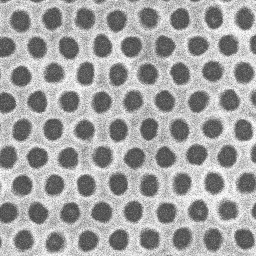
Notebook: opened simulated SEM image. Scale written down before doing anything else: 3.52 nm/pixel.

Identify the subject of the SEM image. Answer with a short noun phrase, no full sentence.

a regular array of holes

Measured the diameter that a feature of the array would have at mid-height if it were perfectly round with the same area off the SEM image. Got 0.0744 microns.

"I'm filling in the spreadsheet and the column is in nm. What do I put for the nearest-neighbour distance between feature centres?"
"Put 108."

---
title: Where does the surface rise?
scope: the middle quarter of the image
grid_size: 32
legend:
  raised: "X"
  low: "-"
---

XXXX----XXXX---XXXX---XXXXX----X
XXX-----XXX-----XX-----XXXX----X
XXX-----XXX-----XX------XX------
XXX----XXXX-----XX------XXX-----
XXXX---XXXXX---XXXX----XXXXX---X
XXXXX-XXXXXXX-XXXXXXXXXXXXXXXXXX
XXXXXXXXXXXXXXXXXXXXXXXXX-XXXXXX
---XXXXX---XXXXX---XXXX----XXXXX
----XXX-----XXX-----XXX-----XXX-
----XXX-----XXX-----XXX-----XXX-
----XXX-----XXX----XXXX-----XXX-
---XXXXX---XXXX---XXXXXX---XXXXX
XXXXXXXXXXXXXXXXXXXXXXXXXXXXXXXX
XXXXXXXXXXXXXXXXXXXXX-XXXXXXXXXX
XXXX---XXXXX---XXXXX---XXXX---XX
XXX----XXXX-----XXX-----XX-----X
XX------XXX-----XXX----XXX-----X
XXX-----XXX-----XXX----XXXX----X
XXXX---XXXXX---XXXXX---XXXX----X
XXXXXXXXXXXXXXXXXXXXXXXXXXXXXXXX
XXXXXXXXX-XXXXXXXXXXXXXXXXXXXXXX
---XXXXX----XXXX---XXXXX---XXXX-
---XXXX-----XXX-----XXX----XXX--
----XXX-----XXX-----XXX-----XX--
---XXXX-----XXX-----XXX-----XXX-
---XXXXXX--XXXXX---XXXXX---XXXXX
XXXXXXXXXXXXXXXXX-XXXXXXXXXXXXXX
XXXXX-XXXXXX---XXXXX--XXXXXX---X
XXXX---XXXX-----XXXX---XXXX-----
XXX-----XXX-----XXX----XXXX-----
XXX-----XXX-----XXX-----XXX-----
XXX-----XXXX----XXX-----XXX----X